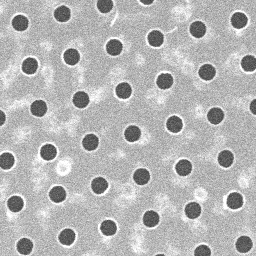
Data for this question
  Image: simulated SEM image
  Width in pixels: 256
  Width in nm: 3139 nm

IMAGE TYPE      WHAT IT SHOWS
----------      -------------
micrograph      a regular array of holes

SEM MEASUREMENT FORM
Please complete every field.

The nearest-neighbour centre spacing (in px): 42.8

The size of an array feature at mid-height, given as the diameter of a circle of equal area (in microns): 0.215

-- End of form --